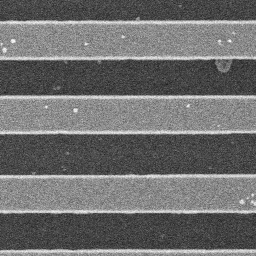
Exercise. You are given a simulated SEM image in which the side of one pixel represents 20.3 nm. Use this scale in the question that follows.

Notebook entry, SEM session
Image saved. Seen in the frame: lines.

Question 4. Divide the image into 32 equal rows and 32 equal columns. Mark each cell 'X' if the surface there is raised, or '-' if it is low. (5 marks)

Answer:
--------------------------------
--------------------------------
--------------------------------
XXXXXXXXXXXXXXXXXXXXXXXXXXXXXXXX
XXXXXXXXXXXXXXXXXXXXXXXXXXXXXXXX
XXXXXXXXXXXXXXXXXXXXXXXXXXXXXXXX
XXXXXXXXXXXXXXXXXXXXXXXXXXXXXXXX
--------------------------------
--------------------------------
--------------------------------
--------------------------------
--------------------------------
XXXXXXXXXXXXXXXXXXXXXXXXXXXXXXXX
XXXXXXXXXXXXXXXXXXXXXXXXXXXXXXXX
XXXXXXXXXXXXXXXXXXXXXXXXXXXXXXXX
XXXXXXXXXXXXXXXXXXXXXXXXXXXXXXXX
XXXXXXXXXXXXXXXXXXXXXXXXXXXXXXXX
--------------------------------
--------------------------------
--------------------------------
--------------------------------
--------------------------------
XXXXXXXXXXXXXXXXXXXXXXXXXXXXXXXX
XXXXXXXXXXXXXXXXXXXXXXXXXXXXXXXX
XXXXXXXXXXXXXXXXXXXXXXXXXXXXXXXX
XXXXXXXXXXXXXXXXXXXXXXXXXXXXXXXX
XXXXXXXXXXXXXXXXXXXXXXXXXXXXXXXX
--------------------------------
--------------------------------
--------------------------------
--------------------------------
XXXXXXXXXXXXXXXXXXXXXXXXXXXXXXXX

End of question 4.